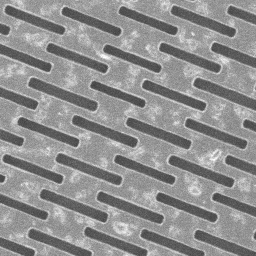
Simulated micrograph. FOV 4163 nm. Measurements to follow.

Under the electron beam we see a regular array of holes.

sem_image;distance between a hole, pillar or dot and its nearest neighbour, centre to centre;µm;0.636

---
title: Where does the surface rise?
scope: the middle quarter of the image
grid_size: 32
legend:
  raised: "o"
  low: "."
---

ooooo......oooooooo.....oooooooo
ooooooo....oooooooooo...oooooooo
oooooooooooooooooooooooooooooooo
oooooooooooooooooooooooooooooooo
ooooooo..ooooooooooo..oooooooooo
ooooooo....oooooooo......ooooooo
.ooooooo......ooooooo......ooooo
...ooooooo......ooooooo.......oo
......ooooooo......ooooooo......
o.......oooooooo....oooooooo....
ooo......ooooooooo..ooooooooooo.
oooooo..oooooooooooooooooooooooo
oooooooooooooooooooooooooooooooo
oo...ooooooooooo.ooooooooooooooo
oo......ooooooo.....oooooooooo..
ooo.......oooooo.......ooooooo..
oooooo.......ooooo.......ooooooo
.ooooooo.......ooooo........oooo
...oooooooo.......ooooo.......oo
....ooooooooo.....oooooooo......
oo.ooooooooooooo..oooooooooo....
oooooooooooooooooooooooooooooooo
oooooooooooooooooooooooooooooooo
...oooooooooo...oooooooooo...ooo
.....ooooooo......oooooooo......
........oooooo.......oooooo.....
ooo........oooooo.......oooooo..
ooooo........oooooo.......oooooo
oooooooo.......ooooooo......oooo
ooooooooooo....oooooooooo...oooo
oooooooooooooooooooooooooooooooo
oooooooooooooooooooooooooooooooo